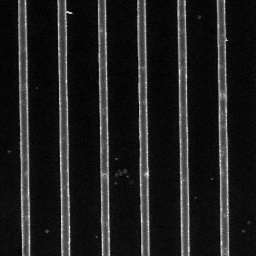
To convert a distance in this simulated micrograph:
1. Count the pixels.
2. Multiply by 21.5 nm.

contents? parallel lines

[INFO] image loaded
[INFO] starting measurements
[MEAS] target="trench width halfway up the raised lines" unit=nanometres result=678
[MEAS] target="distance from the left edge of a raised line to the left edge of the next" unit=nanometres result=856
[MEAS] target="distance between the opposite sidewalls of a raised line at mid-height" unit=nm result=169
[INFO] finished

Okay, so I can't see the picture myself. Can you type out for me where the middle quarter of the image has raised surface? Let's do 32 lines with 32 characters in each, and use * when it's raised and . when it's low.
*........**........*.........**.
*........**........*.........**.
*........**........*.........**.
*........**........*.........**.
*........**........**........**.
*........**........**........**.
*........**........**........**.
*........**........**........**.
*........**........**........**.
*........**........**........**.
*........**........**........**.
*........**........**........**.
*........**........**........**.
*........**........**........**.
*........**........**........**.
*........**........**........**.
*........**........**........**.
*........**........**........**.
*........**........**........**.
*........**........**........**.
*........**........**........**.
*........**........**........**.
*........**........**........**.
*........**........**........**.
*........**........**........**.
*........**........**........**.
*........**........**........**.
*........**........**........**.
*........**........**........**.
*........**........**........**.
*........**........**........**.
*........**........**........**.